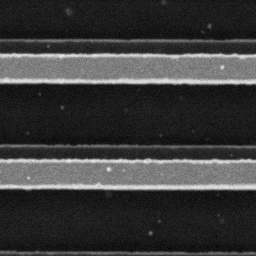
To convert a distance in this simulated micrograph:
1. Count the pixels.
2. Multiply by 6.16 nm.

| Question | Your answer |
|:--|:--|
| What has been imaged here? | lines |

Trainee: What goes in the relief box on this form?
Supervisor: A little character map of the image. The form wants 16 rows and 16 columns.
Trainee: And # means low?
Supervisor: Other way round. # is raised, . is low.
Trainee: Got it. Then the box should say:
................
................
................
################
################
................
................
................
................
................
################
################
................
................
................
................